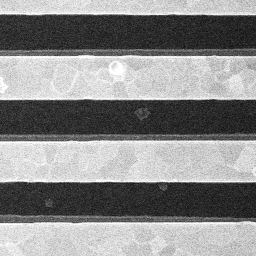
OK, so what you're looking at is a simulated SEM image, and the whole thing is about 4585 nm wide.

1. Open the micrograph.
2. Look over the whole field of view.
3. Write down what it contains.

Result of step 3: lines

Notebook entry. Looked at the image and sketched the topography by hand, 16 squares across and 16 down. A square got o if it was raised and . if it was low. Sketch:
oooooooooooooooo
................
................
oooooooooooooooo
oooooooooooooooo
oooooooooooooooo
................
................
......oo.ooooooo
oooooooooooooooo
oooooooooooooooo
................
................
................
oooooooooooooooo
oooooooooooooooo